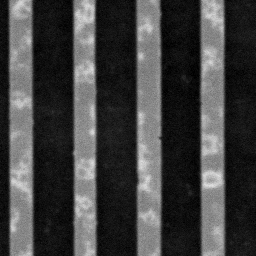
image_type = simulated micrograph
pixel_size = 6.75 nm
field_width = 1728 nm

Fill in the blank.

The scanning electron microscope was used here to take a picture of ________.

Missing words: one or a few lines or trenches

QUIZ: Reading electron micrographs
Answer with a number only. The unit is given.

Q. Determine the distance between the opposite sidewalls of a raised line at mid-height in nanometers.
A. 153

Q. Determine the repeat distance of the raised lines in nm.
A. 432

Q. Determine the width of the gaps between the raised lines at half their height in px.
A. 41.9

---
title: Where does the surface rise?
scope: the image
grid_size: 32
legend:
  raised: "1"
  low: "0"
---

01110000011100000111000001110000
01110000011100000111000001110000
01110000011100000111000001110000
01110000011100000111000001110000
01110000011100000111000001110000
01110000011100000111000001110000
01110000011100000111000001110000
01110000011100000111000001110000
01110000011100000111000001110000
01110000011100000111000001110000
01110000011100000111000001110000
01110000011100000111000001110000
01110000011100000111000001110000
01110000011100000111000001110000
01110000011100000111000001110000
01110000011100000111000001110000
01110000011100000111000001110000
01110000011100000111000001110000
01110000011100000111000001110000
01110000011100000111000001110000
01110000011100000111000001110000
01110000011100000111000001110000
01110000011100000111000001110000
01110000011100000111000001110000
01110000011100000111000001110000
01110000011100000111000001110000
01110000011100000111000001110000
01110000011100000111000001110000
01110000011100000111000001110000
01110000011100000111000001110000
01110000011100000111000001110000
01110000011100000111000001110000